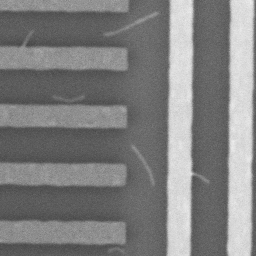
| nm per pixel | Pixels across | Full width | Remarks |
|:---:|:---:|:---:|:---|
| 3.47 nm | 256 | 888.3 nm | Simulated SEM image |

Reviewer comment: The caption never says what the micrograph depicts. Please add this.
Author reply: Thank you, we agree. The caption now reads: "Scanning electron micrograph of groups of lines, slits or small figures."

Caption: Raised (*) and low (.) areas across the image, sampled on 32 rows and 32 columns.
****************.....***.....***
.....................***.....***
.....................***.....***
.....................***.....***
.....................***.....***
.....................***.....***
****************.....***.....***
****************.....***.....***
****************.....***.....***
.....................***.....***
.....................***.....***
.....................***.....***
.....................***.....**.
****************.....***.....**.
****************.....***.....**.
****************.....***.....**.
.....................***.....**.
.....................***.....**.
.....................***.....**.
.....................***.....**.
*******....*.........***.....**.
****************.....***.....**.
****************.....***.....**.
.....................***.....**.
.....................***.....**.
.....................***.....**.
.....................***.....**.
.....................***.....**.
****************.....***.....**.
****************.....***.....**.
.....................***.....**.
.....................***.....**.